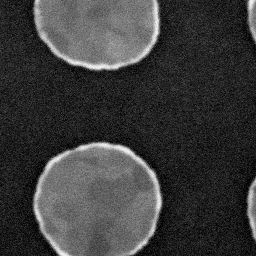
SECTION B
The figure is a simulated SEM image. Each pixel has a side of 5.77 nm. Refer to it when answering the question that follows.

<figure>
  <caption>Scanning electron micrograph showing raised bodies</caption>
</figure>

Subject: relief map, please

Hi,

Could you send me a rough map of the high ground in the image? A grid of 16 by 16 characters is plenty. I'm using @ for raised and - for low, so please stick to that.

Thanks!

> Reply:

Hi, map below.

--@@@@@@@@------
--@@@@@@@@------
---@@@@@@@------
----@@@@@-------
----------------
----------------
----------------
----------------
----------------
----@@@@--------
---@@@@@@-------
--@@@@@@@@------
--@@@@@@@@------
--@@@@@@@@------
---@@@@@@@------
---@@@@@@-------